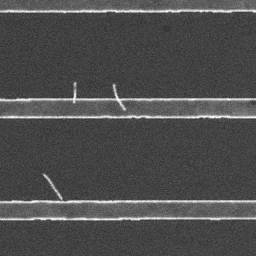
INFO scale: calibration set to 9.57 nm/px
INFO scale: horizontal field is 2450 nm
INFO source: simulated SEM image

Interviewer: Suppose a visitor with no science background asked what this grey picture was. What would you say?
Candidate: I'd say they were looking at lines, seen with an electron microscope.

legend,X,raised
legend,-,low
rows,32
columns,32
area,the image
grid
XXXXXXXXXXXXXXXXXXXXXXXXXXXXXXXX
--------------------------------
--------------------------------
--------------------------------
--------------------------------
--------------------------------
--------------------------------
--------------------------------
--------------------------------
--------------------------------
--------------------------------
--------------------------------
---XXXXXXXXXXXXXXXXXXXXXXXXXXXXX
XXXXXXXXXXXXXXXXXXXXXXXXXXXXXXXX
XXXXXXXXXXXXXXXXXXXXXXXXXXXXXXXX
--------------------------------
--------------------------------
--------------------------------
--------------------------------
--------------------------------
--------------------------------
--------------------------------
--------------------------------
--------------------------------
--------------------------------
XXXXXXXXXXXXXXXXXXXXXXXXXXXXXXXX
XXXXXXXXXXXXXXXXXXXXXXXXXXXXXXXX
--------------------------------
--------------------------------
--------------------------------
--------------------------------
--------------------------------